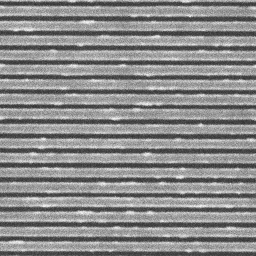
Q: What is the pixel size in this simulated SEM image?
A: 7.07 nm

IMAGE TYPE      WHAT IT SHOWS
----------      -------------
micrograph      parallel lines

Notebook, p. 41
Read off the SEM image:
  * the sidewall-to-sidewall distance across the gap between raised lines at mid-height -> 5.5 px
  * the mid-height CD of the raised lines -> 0.0646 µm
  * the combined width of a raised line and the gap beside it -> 14.7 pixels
